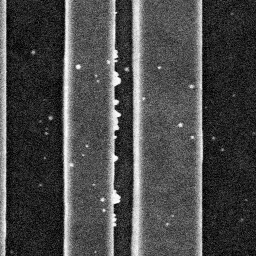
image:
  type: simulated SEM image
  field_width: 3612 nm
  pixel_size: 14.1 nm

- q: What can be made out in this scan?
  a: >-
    lines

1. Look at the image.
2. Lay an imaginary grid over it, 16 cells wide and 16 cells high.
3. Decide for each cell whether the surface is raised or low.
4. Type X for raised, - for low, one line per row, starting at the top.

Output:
----XXXXXXXXX---
----XXXXXXXXX---
----XXXXXXXXX---
----XXXXXXXXX---
----XXXXXXXXX---
----XXXXXXXXX---
----XXXXXXXXX---
----XXXXXXXXX---
----XXXXXXXXX---
----XXXXXXXXX---
----XXXXXXXXX---
----XXXXXXXXX---
----XXXXXXXXX---
----XXXXXXXXX---
----XXXXXXXXX---
----XXXXXXXXX---